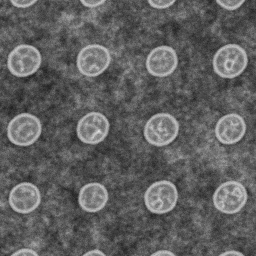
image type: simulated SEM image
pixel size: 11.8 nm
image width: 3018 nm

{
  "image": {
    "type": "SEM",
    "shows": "a regular array of raised bodies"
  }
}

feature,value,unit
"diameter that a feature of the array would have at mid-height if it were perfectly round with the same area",367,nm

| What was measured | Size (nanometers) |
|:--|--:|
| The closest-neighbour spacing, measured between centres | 802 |